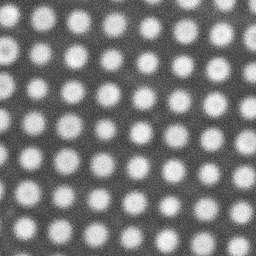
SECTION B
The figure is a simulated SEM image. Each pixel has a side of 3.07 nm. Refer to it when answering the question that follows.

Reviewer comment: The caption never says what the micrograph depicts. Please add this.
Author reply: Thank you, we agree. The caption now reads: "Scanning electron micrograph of a regular array of raised bodies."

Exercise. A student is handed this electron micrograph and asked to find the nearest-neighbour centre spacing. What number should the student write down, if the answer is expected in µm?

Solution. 0.107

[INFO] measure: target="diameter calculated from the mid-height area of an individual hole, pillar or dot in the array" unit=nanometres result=60